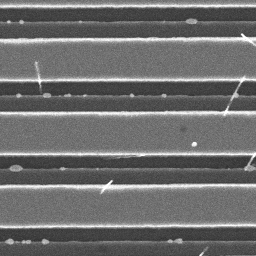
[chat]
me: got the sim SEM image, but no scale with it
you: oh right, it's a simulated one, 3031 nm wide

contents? lines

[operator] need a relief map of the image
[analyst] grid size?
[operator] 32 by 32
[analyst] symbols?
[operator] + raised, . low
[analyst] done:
++++++++++++++++++++++++++++++++
................................
................................
................................
................................
++++++++++++++++++++++++++++++++
++++++++++++++++++++++++++++++++
++++++++++++++++++++++++++++++++
++++++++++++++++++++++++++++++++
++++++++++++++++++++++++++++++++
................................
................................
................................
................................
++++++++++++++++++++++++++++++++
++++++++++++++++++++++++++++++++
++++++++++++++++++++++++++++++++
++++++++++++++++++++++++++++++++
++++++++++++++++++++++++++++++++
...............................+
................................
................................
................................
++++++++++++++++++++++++++++++++
++++++++++++++++++++++++++++++++
++++++++++++++++++++++++++++++++
++++++++++++++++++++++++++++++++
++++++++++++++++++++++++++++++++
................................
................................
................................
................................